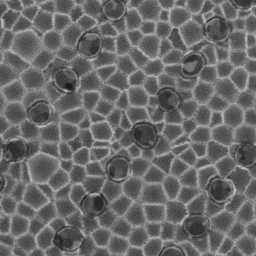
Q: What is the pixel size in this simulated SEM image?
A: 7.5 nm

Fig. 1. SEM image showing a regular array of raised bodies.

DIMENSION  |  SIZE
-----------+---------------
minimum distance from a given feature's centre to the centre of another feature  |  0.176 microns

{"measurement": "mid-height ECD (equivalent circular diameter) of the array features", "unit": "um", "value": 0.166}